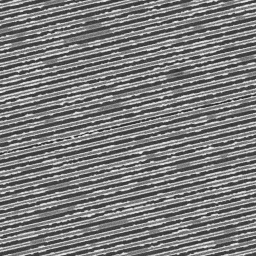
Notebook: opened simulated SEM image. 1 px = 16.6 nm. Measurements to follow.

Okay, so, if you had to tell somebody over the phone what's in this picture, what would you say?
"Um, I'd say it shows parallel lines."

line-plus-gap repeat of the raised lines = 136 nanometres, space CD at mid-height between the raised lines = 58.6 nanometres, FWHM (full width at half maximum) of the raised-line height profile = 0.0849 micrometres